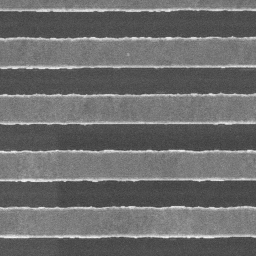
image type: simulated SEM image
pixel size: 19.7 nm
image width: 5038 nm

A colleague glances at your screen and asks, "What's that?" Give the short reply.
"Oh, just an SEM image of lines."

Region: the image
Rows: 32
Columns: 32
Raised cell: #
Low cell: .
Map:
################################
................................
................................
................................
................................
################################
################################
################################
................................
................................
................................
................................
################################
################################
################################
##.#...##.#.....................
................................
................................
................................
################################
################################
################################
############....##..............
................................
................................
................................
################################
################################
################################
################################
................................
................................